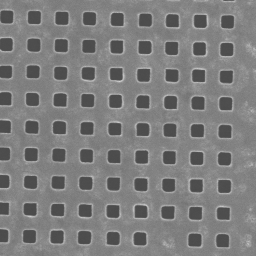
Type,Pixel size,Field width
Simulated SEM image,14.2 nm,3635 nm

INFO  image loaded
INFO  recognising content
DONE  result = a regular array of holes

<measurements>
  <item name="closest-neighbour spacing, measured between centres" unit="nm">384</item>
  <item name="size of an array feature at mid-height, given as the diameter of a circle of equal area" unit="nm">206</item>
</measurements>